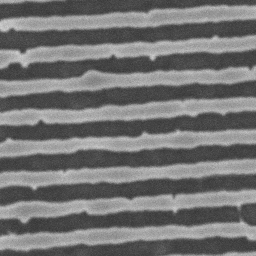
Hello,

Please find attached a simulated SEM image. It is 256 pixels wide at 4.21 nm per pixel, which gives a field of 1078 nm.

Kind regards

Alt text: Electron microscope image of parallel lines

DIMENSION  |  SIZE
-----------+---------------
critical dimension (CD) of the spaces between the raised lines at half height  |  70.9 nanometers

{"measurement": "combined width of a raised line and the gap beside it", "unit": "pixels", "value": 30.8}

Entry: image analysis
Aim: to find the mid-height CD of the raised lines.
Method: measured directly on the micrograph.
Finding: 0.0562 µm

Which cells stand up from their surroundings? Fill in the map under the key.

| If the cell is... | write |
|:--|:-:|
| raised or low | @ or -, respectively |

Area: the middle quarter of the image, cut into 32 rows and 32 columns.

--------------------------------
--------------------------------
-----@@@@@@@@----@@@@@@@@@@@@@@@
--@@@@@@@@@@@@@@@@@@@@@@@@@@@@@@
@@@@@@@@@@@@@@@@@@@@@@@@@@@@@@@@
@@@@@@@@@@@@@@@@@@--------------
@@@@--@-------------------------
--------------------------------
--------------------------------
--------------------------@@@-@@
-----------@@--@@@@@@@@@@@@@@@@@
-----@@@@@@@@@@@@@@@@@@@@@@@@@@@
@@@@@@@@@@@@@@@@@@@@@@@@@@@@@@-@
@@@@@@@@@@@@@@@@@@@@@-----------
@@@@----------------------------
--------------------------------
--------------------------------
--------------------@------@@@@@
---@-------@-@@@@-@@@@@@@@@@@@@@
@@@@@@@@@@@@@@@@@@@@@@@@@@@@@@@@
@@@@@@@@@@@@@@@@@@@@@@@@@@@@@@@@
@@@--------@@@@@@@@-------------
--------------------------------
--------------------------------
--------------------------------
---------------------------@@@@@
---@@@@@@@@@@@@@@@@@@@@@@@@@@@@@
@@@@@@@@@@@@@@@@@@@@@@@@@@@@@@@@
@@@@@@@@@@@@@@@@@@@@@@-@@-@@@---
@@@@@@@@@--@@@@@----------------
--------------------------------
--------------------------------